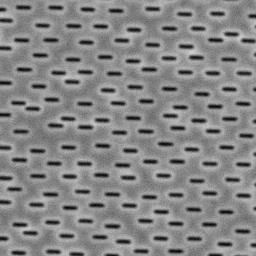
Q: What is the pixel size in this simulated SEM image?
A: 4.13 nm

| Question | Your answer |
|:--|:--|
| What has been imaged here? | a regular array of holes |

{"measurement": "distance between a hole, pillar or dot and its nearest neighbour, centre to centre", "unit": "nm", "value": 78.3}